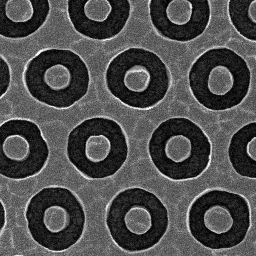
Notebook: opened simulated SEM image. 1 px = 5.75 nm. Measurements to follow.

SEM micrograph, a regular array of ring-shaped grooves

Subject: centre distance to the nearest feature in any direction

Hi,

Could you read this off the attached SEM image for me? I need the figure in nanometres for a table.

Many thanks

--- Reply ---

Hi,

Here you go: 463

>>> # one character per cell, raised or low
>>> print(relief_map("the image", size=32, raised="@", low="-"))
-@@@--@@@--@@@--@@@--@@@--@@@--@
-@@@--@@@--@@@--@@@--@@@--@@@--@
-@@@--@@@---@---@@@--@@@--@@@---
-----@@@@------@@@@-------@@@---
@--@@@@@@@@---@@@@@@-----@@@@@--
@@@@@@@@@@@@@@@@@@@@@@@@@@@@@@@@
@@@@@----@@@@@@----@@@@@@@---@@@
-@@@------@@@@------@@@@@-----@@
-@@---@@---@@----@---@@@---@---@
-@@---@@@--@@---@@@--@@@--@@@--@
-@@---@@---@@---@@@--@@@--@@@--@
-@@@-------@@@-------@@@--@@---@
@@@@@-----@@@@@-----@@@@@-----@@
@@@@@@@-@@@@@@@@@-@@@@@@@@---@@@
@@@@@@@@@@@@@@@@@@@@@@@@@@@@@@@@
----@@@@@@-----@@@@@----@@@@@@@-
-----@@@@------@@@@------@@@@@--
-@@---@@---@@---@@@--@@@--@@@--@
@@@@--@@---@@@--@@@--@@@--@@@--@
-@@---@@---@@---@@@--@@@--@@@--@
------@@@------@@@@-------@@@---
-----@@@@@----@@@@@@-----@@@@@--
@@@@@@@@@@@@@@@@@@@@@@@@@@@@@@@@
@@@@@@--@@@@@@@@@@@@@@@@@@@@@@@@
@@@@-----@@@@@@----@@@@@@-----@@
@@@@------@@@@------@@@@-------@
-@@---@@--@@@---@@---@@@--@@---@
-@@---@@---@@---@@@--@@@--@@@--@
@@@@--@@--@@@@--@@@--@@@--@@@--@
@@@@------@@@@------@@@@-------@
@@@@@----@@@@@@----@@@@@@-----@@
@@@@@@@@@@@@@@@@@@@@@@@@@@@@@@@@